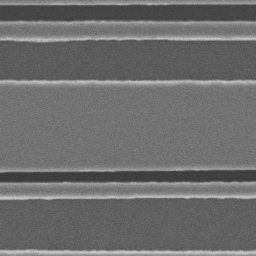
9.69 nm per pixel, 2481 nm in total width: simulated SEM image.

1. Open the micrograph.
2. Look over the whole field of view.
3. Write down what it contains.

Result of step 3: lines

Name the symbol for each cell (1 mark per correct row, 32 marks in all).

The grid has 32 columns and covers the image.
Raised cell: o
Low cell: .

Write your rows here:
ooooooooooooooooooooo...........
................................
................................
oooooooooooooooooooooooooooooooo
oooooooooooooooooooooooooooooooo
................................
................................
................................
................................
................................
oooooooooooooooooooooooooooooooo
oooooooooooooooooooooooooooooooo
oooooooooooooooooooooooooooooooo
oooooooooooooooooooooooooooooooo
oooooooooooooooooooooooooooooooo
oooooooooooooooooooooooooooooooo
oooooooooooooooooooooooooooooooo
oooooooooooooooooooooooooooooooo
oooooooooooooooooooooooooooooooo
oooooooooooooooooooooooooooooooo
oooooooooooooooooooooooooooooooo
o..o............................
................................
oooooooooooooooooooooooooooooooo
oooooooooooooooooooooooooooooooo
................................
................................
................................
................................
................................
................................
...o............................